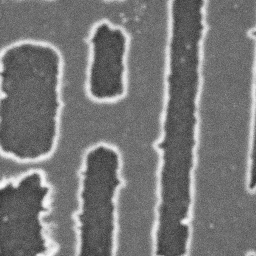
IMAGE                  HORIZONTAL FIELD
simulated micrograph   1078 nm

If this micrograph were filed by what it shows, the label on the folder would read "one or a few lines or trenches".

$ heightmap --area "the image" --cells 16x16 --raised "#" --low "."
###########..###
###########..###
######..###..###
....##..###..###
....##..###.####
....##..##..####
....######..####
....######..####
...#######..####
...###.###..####
#####..###..####
#..##..###..####
...##..###..####
...##..###..####
...##..###..####
...##..###..####